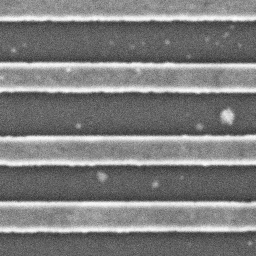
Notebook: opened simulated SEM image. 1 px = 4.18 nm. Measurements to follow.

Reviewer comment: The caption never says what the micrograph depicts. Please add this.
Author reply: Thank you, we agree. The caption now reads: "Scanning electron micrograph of lines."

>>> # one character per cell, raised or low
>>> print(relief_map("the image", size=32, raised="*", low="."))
********************************
********************************
***.********...***.***..*....**.
................................
................................
................................
................................
................................
********************************
********************************
********************************
................................
................................
................................
................................
................................
................................
********************************
********************************
********************************
.*.........*.............*......
................................
................................
................................
................................
********************************
********************************
********************************
********************************
................................
................................
................................